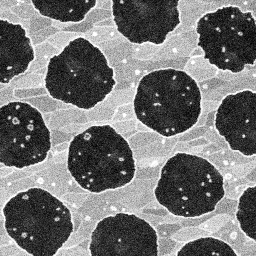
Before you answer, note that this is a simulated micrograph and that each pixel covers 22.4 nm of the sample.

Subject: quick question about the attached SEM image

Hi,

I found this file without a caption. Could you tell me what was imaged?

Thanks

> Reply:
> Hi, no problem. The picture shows holes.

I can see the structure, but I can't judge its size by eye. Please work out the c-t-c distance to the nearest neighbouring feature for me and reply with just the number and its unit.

1950 nm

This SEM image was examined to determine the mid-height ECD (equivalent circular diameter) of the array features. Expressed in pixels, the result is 67.5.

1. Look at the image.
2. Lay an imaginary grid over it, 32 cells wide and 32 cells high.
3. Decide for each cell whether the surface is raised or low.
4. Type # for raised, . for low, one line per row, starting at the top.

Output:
####........##........##########
#####......###........####.....#
.######...####.........##.......
...############.......###.......
...############......####.......
....####....#####.#.#####.......
....####.....############.......
....##.......#############......
...###........#############....#
..####........####......########
######........###........#######
######........###........#####..
#######......####........###....
....######..#####........##.....
.....############........##.....
......############......###.....
......####.....####....####.....
......###.......############....
......###.......#############...
......##.........#####...#######
.....###.........####......#####
#########........###.......#####
#########.......####........####
####.#####.....####.........###.
##.....############.........##..
#.......############.......###..
.........############.....####..
#........####.....############..
#........###.......###########..
#........##.........###########.
##......###.........###.....####
###....####.........##.......###